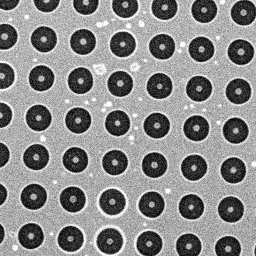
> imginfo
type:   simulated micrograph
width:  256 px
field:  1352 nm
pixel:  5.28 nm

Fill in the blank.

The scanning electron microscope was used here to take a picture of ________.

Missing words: an array of small figures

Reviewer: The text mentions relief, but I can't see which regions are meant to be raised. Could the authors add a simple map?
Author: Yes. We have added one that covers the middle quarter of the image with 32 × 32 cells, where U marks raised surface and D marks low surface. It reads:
UUUUUUUUUUUUUUUUUUUUUUUUUUUUUUUU
UUDDDDUUUUUUUUUUUUUUUUUUUUUUUUUU
UDDDDDDUUUUUDDDDUUUUUUDDDUUUUUUU
UDDDDDDUUUUDDDDDDUUUUDDDDDDUUUUU
UDDDDDDUUUUDDDDDDUUUUDDDDDDUUUUD
UDDDDDDUUUUDDDDDDUUUDDDUDDDUUUUD
UUDDDDDUUUUDDDDDDUUUUDDDDDDUUUDD
UUUDDUUUUUUUDDDDUUUUUDDDDDDUUUUD
UUUUUUUUUUUUUUUUUUUUUUDDDDUUUUUD
UUUUUUUUUUUUUUUUUUUUUUUUUUUUUUUU
UUUUUUUUUUUUUUUUUUUUUUUUUUUUUUUU
UUDDDDUUUUUUUDUUUUUUUUUUUUUUUUUU
UDDDDDDUUUUDDDDDUUUUUUDDDUUUUUUU
DDDDDDDUUUDDDDDDUUUUDDDDDDUUUUUD
DDDUDDDUUUDDDUDDDUUUDDDDDDUUUUDD
DDDDDDDUUUDDDDDDDUUUDDDUDDDUUUDD
UDDDDDUUUUUDDDDDUUUUDDDDDDUUUUDD
UUUDUUUUUUUUDDDUUUUUUDDDDDUUUUDD
UUUUUUUUUUUUUUUUUUUUUUDDUUUUUUUD
UUUUUUUUUUUUUUUUUUUUUUUUUUUUUUUU
UUUUUUUUUUUUUUUUUUUUUUUUUUUUUUUU
UDDDDUUUUUUUDDUUUUUUUUUUUUUUUUUU
DDDDDDUUUUDDDDDUUUUUUDDDDUUUUUUU
DDDDDDUUUUDDDDDDUUUUDDDDDUUUUUDD
DDDDDDUUUDDDUDDDUUUDDDDDDDUUUDDD
DDDDDDUUUUDDDDDDUUUDDDUDDDUUUDDD
UDDDDUUUUUDDDDDUUUUUDDDDDDUUUDDD
UUUUUUUUUUUDDDUUUUUUDDDDDUUUUUDD
UUUUUUUUUUUUUUUUUUUUUUDDUUUUUUDD
UUUUUUUUUUUUUUUUUUUUUUUUUUUUUUUU
UUDUUUUUUUUUUUUUUUUUUUUUUUUUUUUU
DDDDDUUUUUDDDDUUUUUUUUUUUUUUUUUU